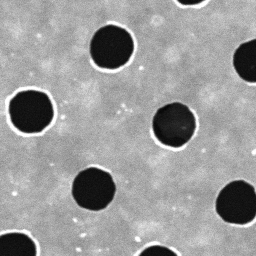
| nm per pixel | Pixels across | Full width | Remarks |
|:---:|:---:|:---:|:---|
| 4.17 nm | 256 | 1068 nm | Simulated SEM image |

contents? holes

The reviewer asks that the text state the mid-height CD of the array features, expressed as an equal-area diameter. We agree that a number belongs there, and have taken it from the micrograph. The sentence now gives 182 nanometres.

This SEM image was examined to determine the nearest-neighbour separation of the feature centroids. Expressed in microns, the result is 0.416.